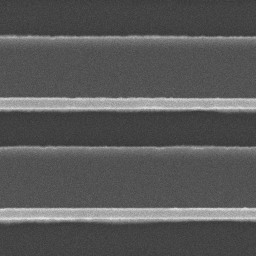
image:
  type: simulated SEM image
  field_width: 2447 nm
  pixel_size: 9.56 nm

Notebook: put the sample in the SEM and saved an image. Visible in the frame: lines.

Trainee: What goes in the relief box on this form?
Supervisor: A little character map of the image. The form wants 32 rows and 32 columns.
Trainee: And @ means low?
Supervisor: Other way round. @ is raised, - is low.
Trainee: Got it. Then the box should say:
--------------------------------
--------------------------------
--------------------------------
--------------------------------
--------------------------------
@@@@@@@@@@@@@@@@@@@@@@@@@@@@@@@@
@@@@@@@@@@@@@@@@@@@@@@@@@@@@@@@@
@@@@@@@@@@@@@@@@@@@@@@@@@@@@@@@@
@@@@@@@@@@@@@@@@@@@@@@@@@@@@@@@@
@@@@@@@@@@@@@@@@@@@@@@@@@@@@@@@@
@@@@@@@@@@@@@@@@@@@@@@@@@@@@@@@@
@@@@@@@@@@@@@@@@@@@@@@@@@@@@@@@@
@@@@@@@@@@@@@@@@@@@@@@@@@@@@@@@@
@@@@@@@@@@@@@@@@@@@@@@@@@@@@@@@@
--------------------------------
--------------------------------
--------------------------------
--------------------------------
-------------@------------------
@@@@@@@@@@@@@@@@@@@@@@@@@@@@@@@@
@@@@@@@@@@@@@@@@@@@@@@@@@@@@@@@@
@@@@@@@@@@@@@@@@@@@@@@@@@@@@@@@@
@@@@@@@@@@@@@@@@@@@@@@@@@@@@@@@@
@@@@@@@@@@@@@@@@@@@@@@@@@@@@@@@@
@@@@@@@@@@@@@@@@@@@@@@@@@@@@@@@@
@@@@@@@@@@@@@@@@@@@@@@@@@@@@@@@@
@@@@@@@@@@@@@@@@@@@@@@@@@@@@@@@@
--------------------------------
--------------------------------
--------------------------------
--------------------------------
--------------------------------